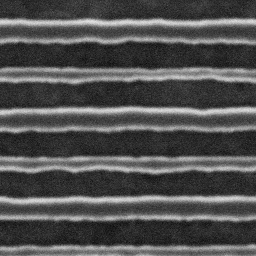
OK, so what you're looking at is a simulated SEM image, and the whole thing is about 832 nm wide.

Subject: lines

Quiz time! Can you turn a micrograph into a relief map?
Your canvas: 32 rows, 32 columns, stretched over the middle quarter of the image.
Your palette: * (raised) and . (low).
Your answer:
................................
*********************..*********
********************************
********************************
..**............................
................................
................................
................................
................................
................................
................................
********..**********************
********************************
********************************
********************************
********************************
*........***....................
................................
................................
................................
................................
................................
................................
..***************..*******...***
********************************
********************************
.****..........**************...
................................
................................
................................
................................
................................